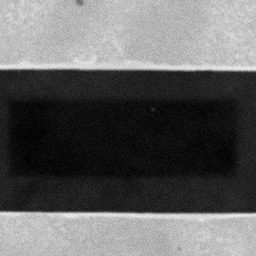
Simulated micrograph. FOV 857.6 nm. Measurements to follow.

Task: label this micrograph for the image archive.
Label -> wiring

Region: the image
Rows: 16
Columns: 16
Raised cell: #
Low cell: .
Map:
################
################
################
################
................
................
................
................
................
................
................
................
................
####.####.....##
################
################